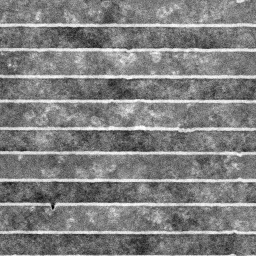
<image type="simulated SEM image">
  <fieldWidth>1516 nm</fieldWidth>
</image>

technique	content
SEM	parallel lines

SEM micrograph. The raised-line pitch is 51.7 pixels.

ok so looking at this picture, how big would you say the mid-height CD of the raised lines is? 164 nanometres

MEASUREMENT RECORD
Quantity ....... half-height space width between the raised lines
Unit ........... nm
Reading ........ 144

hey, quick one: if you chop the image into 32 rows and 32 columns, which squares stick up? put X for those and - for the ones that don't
XXXXXXXXXXXXXXXXXXXXXXXXXXXXXXXX
XXXXXXXXXXXXXXXXXXXXXXXXXXXXXXXX
XXXXXXXXXXXXXXXXXXXXXXXXXXXXXXXX
--------------------------------
--------------------------------
--------------------------------
XXXXXXXXXXXXXXXXXXXXXXXXXXXXXXXX
XXXXXXXXXXXXXXXXXXXXXXXXXXXXXXXX
XXXXXXXXXXXXXXXXXXXXXXXXXXXXXXXX
---X-XXXXXXXXXXXXXXXXXXXXXXXXXXX
--------------------------------
--------------------------------
--------------------------------
XXXXXXXXXXXXXXXXXXXXXXXXXXXXXXXX
XXXXXXXXXXXXXXXXXXXXXXXXXXXXXXXX
XXXXXXXXXXXXXXXXXXXXXXXXXXXXXXXX
--------------------------------
--------------------------------
--------------------------------
XXXXXXXXXXXXXXXXXXXXXXXXXXXXXXXX
XXXXXXXXXXXXXXXXXXXXXXXXXXXXXXXX
XXXXXXXXXXXXXXXXXXXXXXXXXXXXXXXX
XXXXXXXXXXXXXXXXXXXXXXXXXXXXXXXX
--------------------------------
--------------------------------
--------------------------------
XXXXXXXXXXXXXXXXXXXXXXXXXXXXXXXX
XXXXXXXXXXXXXXXXXXXXXXXXXXXXXXXX
XXXXXXXXXXXXXXXXXXXXXXXXXXXXXXXX
--------------------------------
--------------------------------
--------------------------------